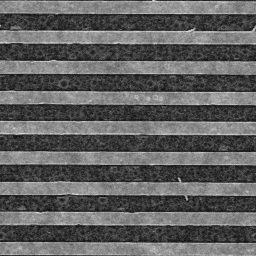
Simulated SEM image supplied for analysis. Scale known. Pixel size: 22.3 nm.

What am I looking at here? parallel lines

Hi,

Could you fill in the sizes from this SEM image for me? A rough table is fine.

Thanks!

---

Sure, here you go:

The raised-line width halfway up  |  284 nanometers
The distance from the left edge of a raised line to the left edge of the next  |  672 nanometers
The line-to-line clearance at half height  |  395 nanometers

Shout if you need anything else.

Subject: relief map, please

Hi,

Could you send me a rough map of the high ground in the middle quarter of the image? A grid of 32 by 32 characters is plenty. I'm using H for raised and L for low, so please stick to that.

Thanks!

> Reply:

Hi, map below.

HHHHHHHHHHHHHHHHHHHHHHHHHHHHHHHH
HHHHHHHHHHHHHHHHHHHHHHHHHHHHHHHH
LLLLLLLLLLLLLLLLLLLLLLLLLLLLLLLL
LLLLLLLLLLLLLLLLLLLLLLLLLLLLLLLL
HLLLLLLLLLLLLLLLLLLLLLLLLLLLLLLL
LLLLLLLLLLLLLLLLLLLLLLLLLLLLLLLL
LLLLLLLLLLLLLLLLLLLLLLLLLLLLLLLL
HHHHHHHHHHHHHHHHHHHHHHHHHHHHHHHH
HHHHHHHHHHHHHHHHHHHHHHHHHHHHHHHH
HHHHHHHHHHHHHHHHHHHHHHHHHHHHHHHH
LLLLLLLLLLLLLLLLLLLLLLLLLLLLLLLL
LLLLLLLLLLLLLLLLLLLLLLLLLLLLLLLL
LLLLLLLLLLLLLLLLLLLLLLLLLLLLLLLL
LLLLLLLLLLLLLLLLLLLLLLLLLLLLLLLL
HHHLHHHHHHHHHHHHHHHHHHHLLLLLLLLL
HHHHHHHHHHHHHHHHHHHHHHHHHHHHHHHH
HHHHHHHHHHHHHHHHHHHHHHHHHHHHHHHH
LLLLLLLLLLLLLLLLLLLLLLLLLLLLLLLL
LLLLLLLLLLLLLLLLLLLLLLLLLLLLLLLL
LLLLLLLLLLLLLLLLLLLLLLLLLLLLLLLL
LLLLLLLLLLLLLLLLLLLLLLLLLLLLLLLL
LLLLLLLLLLLLLLLLLLLLLLLLLLLLLLLL
HHHHHHHHHHHHHHHHHHHHHHHHHHHHHHHH
HHHHHHHHHHHHHHHHHHHHHHHHHHHHHHHH
HHHHHHHHHHHHHHHHHHHHHHHHHHHHHHHH
LLLLLLLLLLLLLLLLLLLLLLLLLLLLLLLL
LLLLLLLLLLLLLLLLLLLLLLLLLLLLLLLL
LLLLLLLLLLLLLLLLLLLLLLLLLLLLLLLL
LLLLLLLLLLLLLLLLLLLLLLLLLLLLLLLL
LLLLLLLLLLLLLLLLLLLLLLLLLLLLLLLL
HHHHHHHHHHHHHHHHHHHHHHHHHHHHHHHH
HHHHHHHHHHHHHHHHHHHHHHHHHHHHHHHH